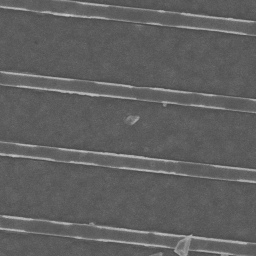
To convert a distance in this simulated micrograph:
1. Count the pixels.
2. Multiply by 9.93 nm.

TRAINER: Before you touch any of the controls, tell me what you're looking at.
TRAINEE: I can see one or a few lines or trenches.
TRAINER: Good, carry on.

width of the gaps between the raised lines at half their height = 586 nm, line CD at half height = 0.139 µm